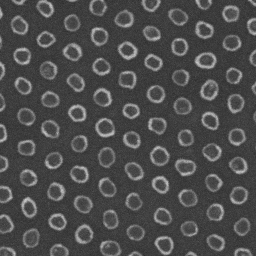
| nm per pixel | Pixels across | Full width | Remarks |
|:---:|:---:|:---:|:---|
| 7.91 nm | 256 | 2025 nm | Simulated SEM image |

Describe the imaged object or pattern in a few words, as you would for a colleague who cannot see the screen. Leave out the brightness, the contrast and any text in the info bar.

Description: a regular array of raised bodies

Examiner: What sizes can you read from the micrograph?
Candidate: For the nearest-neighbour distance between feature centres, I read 0.231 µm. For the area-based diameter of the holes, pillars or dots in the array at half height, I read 16.7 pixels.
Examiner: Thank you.